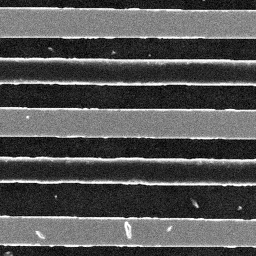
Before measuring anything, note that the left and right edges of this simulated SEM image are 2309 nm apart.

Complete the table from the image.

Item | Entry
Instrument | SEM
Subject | lines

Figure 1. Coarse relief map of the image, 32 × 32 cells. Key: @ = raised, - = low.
--------------------------------
@@@@@@@@@@@@@@@@@@@@@@@@@@@@@@@@
@@@@@@@@@@@@@@@@@@@@@@@@@@@@@@@@
@@@@@@@@@@@@@@@@@@@@@@@@@@@@@@@@
@@@@@@@@@@@@@@@@@@@@@@@@@@@@@@@@
--------------------------------
--------------------------------
@@@@@@@@@@----------------------
@@@@@@@@@@@@@@@@@@@@@@@@@@@@@@@@
@@@@@@@@@@@@@@@@@@@@@@@@@@@@@@@@
--------------@@@@@@@---@@@@@@@@
--------------------------------
--------------------------------
@@@@----------------------------
@@@@@@@@@@@@@@@@@@@@@@@@@@@@@@@@
@@@@@@@@@@@@@@@@@@@@@@@@@@@@@@@@
@@@@@@@@@@@@@@@@@@@@@@@@@@@@@@@@
--------------------------------
--------------------------------
--------------------------------
@@@@@@@@@@@@@@@@@@@@@@@@@@@@@@@@
@@@@@@@@@@@@@@@@@@@@@@@@@@@@@@@@
@@@@@@@@@@@@@@@@@@@@@@@@@@@@@@@@
--------------------------------
--------------------------------
--------------------------------
--------------------------------
@@@@@@@@@@@@@@@@@@@@@@@@@@@@@@@@
@@@@@@@@@@@@@@@@@@@@@@@@@@@@@@@@
@@@@@@@@@@@@@@@@@@@@@@@@@@@@@@@@
@@@@@@@@@@@@@@@@@@@@@@@@@@@@@@@@
--------------------------------